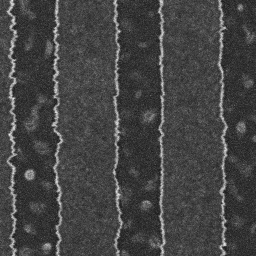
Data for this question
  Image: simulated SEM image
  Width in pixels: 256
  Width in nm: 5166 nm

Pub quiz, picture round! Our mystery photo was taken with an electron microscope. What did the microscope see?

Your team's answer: one or a few lines or trenches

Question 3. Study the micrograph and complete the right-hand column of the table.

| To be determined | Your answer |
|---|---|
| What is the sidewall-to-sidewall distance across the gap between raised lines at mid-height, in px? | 44.2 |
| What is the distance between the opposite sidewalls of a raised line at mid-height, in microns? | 1.23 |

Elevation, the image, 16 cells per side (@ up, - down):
@---@@@---@@@@--
@---@@@---@@@@--
@--@@@@---@@@@--
@--@@@@---@@@@--
@--@@@@---@@@@--
@---@@@---@@@@--
@---@@@---@@@@--
@---@@@---@@@@--
@---@@@---@@@@--
@---@@@---@@@@--
@---@@@---@@@@--
@---@@@---@@@@--
@---@@@---@@@@--
@---@@@---@@@@--
@---@@@---@@@@--
@---@@@---@@@@--